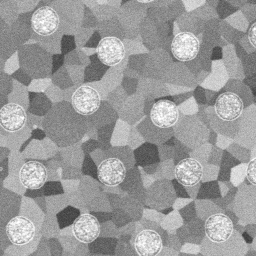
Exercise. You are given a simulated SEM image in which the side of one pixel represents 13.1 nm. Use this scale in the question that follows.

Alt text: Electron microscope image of a regular array of holes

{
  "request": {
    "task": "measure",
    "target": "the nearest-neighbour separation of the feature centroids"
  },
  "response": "818 nanometres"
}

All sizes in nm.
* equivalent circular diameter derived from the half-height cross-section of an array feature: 355